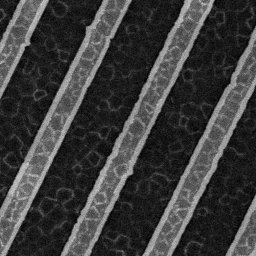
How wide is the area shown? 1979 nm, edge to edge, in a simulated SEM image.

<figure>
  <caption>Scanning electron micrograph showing one or a few lines or trenches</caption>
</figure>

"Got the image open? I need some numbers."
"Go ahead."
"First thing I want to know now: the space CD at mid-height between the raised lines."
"406 nm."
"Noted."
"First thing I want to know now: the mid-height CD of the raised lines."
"167 nm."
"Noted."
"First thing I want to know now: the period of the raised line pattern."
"575 nanometers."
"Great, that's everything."